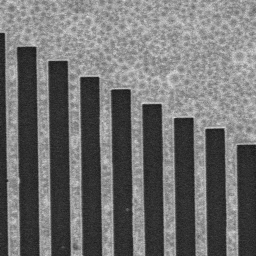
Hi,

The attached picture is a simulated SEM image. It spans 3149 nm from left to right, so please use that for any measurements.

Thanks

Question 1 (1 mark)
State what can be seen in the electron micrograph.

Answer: parallel lines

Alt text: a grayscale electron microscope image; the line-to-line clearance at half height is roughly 251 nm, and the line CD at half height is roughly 135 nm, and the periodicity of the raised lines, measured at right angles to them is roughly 383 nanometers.